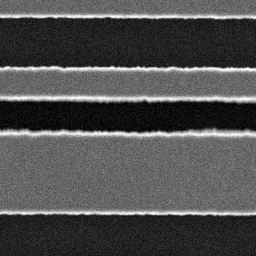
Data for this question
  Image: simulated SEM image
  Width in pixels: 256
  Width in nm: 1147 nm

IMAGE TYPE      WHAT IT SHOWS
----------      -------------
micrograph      lines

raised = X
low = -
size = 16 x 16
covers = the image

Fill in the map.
XXXXXXXXXXXXXXXX
----------------
----------------
----------------
XXXXXXXXXXXXXXXX
XXXXXXXXXXXXXXXX
----------------
----------------
XXXXXXXXXXXXXXXX
XXXXXXXXXXXXXXXX
XXXXXXXXXXXXXXXX
XXXXXXXXXXXXXXXX
XXXXXXXXXXXXXXXX
----------------
----------------
----------------